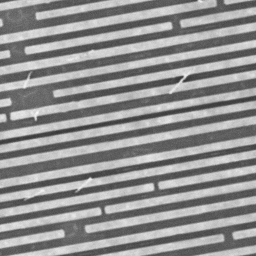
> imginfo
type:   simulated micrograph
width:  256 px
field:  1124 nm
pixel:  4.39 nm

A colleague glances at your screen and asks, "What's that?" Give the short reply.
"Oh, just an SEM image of parallel lines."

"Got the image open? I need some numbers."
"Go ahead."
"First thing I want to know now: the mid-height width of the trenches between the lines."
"8.27 px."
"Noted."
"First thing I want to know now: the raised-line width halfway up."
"32.5 nm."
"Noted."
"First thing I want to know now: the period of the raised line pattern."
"15.6 pixels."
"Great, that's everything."